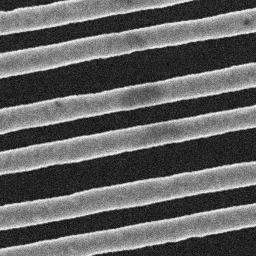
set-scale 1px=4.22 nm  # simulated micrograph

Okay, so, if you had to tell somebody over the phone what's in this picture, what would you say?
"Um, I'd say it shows lines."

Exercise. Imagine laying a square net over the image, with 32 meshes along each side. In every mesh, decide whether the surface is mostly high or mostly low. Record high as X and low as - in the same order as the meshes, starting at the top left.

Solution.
------XXXXXXXXXXXXXXXX----------
XXXXXXXXXXXXXXXX-------------XXX
XXXXXXXXXXX-------------XXXXXXXX
XXXXXX------------XXXXXXXXXXXXXX
------------XXXXXXXXXXXXXXXXX---
-------XXXXXXXXXXXXXXXX---------
-XXXXXXXXXXXXXXXX---------------
XXXXXXXXXXX---------------------
XXXXXXX----------------------XXX
XX---------------------XXXXXXXXX
------------------XXXXXXXXXXXXXX
-------------XXXXXXXXXXXXXXXX---
------XXXXXXXXXXXXXXXXX---------
-XXXXXXXXXXXXXXXXX------------XX
XXXXXXXXXXXX-------------XXXXXXX
XXXXXXX------------XXXXXXXXXXXXX
XX------------XXXXXXXXXXXXXXX---
--------XXXXXXXXXXXXXXX---------
--XXXXXXXXXXXXXXXX--------------
XXXXXXXXXXXXX-------------------
XXXXXXX----------------------XXX
XX----------------------XXXXXXXX
------------------XXXXXXXXXXXXXX
------------XXXXXXXXXXXXXXXXX---
--------XXXXXXXXXXXXXXX---------
-XXXXXXXXXXXXXXXXXX------------X
XXXXXXXXXXXX-------------XXXXXXX
XXXXXXXX------------XXXXXXXXXXXX
XX-------------XXXXXXXXXXXXXXXX-
--------XXXXXXXXXXXXXXXXXX------
----XXXXXXXXXXXXXXXX------------
XXXXXXXXXXXXXX------------------